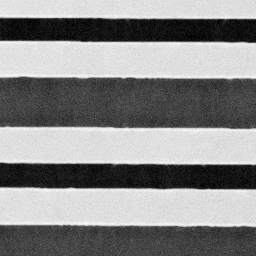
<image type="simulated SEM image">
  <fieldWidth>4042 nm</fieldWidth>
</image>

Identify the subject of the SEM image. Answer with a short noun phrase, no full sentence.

lines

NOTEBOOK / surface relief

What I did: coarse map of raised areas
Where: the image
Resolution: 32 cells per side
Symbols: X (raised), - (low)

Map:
XXXXXXXXXXXXXXXXXXXXXXXXXXXXXXXX
XXXXXXXXXXXXXXXXXXXXXXXXXXXXXXXX
--------------------------------
--------------------------------
--------------------------------
XXXXXXXXXXXXXXXXXXXXXXXXXXXXXXXX
XXXXXXXXXXXXXXXXXXXXXXXXXXXXXXXX
XXXXXXXXXXXXXXXXXXXXXXXXXXXXXXXX
XXXXXXXXXXXXXXXXXXXXXXXXXXXXXXXX
XXXXXXXXXXXXXXXXXXXXXXXXXXXXXXXX
--------------------------------
--------------------------------
--------------------------------
--------------------------------
--------------------------------
--------------------------------
XXXXXXXXXXXXXXXXXXXXXXXXXXXXXXXX
XXXXXXXXXXXXXXXXXXXXXXXXXXXXXXXX
XXXXXXXXXXXXXXXXXXXXXXXXXXXXXXXX
XXXXXXXXXXXXXXXXXXXXXXXXXXXXXXXX
-------------------------------X
--------------------------------
--------------------------------
--------------------------------
XXXXXXXXXXXXXXXXXXXXXXXXXXXXXXXX
XXXXXXXXXXXXXXXXXXXXXXXXXXXXXXXX
XXXXXXXXXXXXXXXXXXXXXXXXXXXXXXXX
XXXXXXXXXXXXXXXXXXXXXXXXXXXXXXXX
--------------------------------
--------------------------------
--------------------------------
--------------------------------